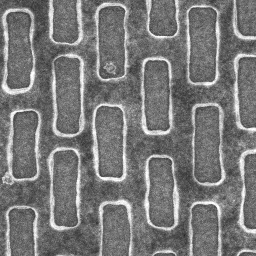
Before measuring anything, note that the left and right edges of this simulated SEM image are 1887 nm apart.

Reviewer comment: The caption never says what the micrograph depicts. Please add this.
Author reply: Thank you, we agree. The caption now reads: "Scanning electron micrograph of a regular array of holes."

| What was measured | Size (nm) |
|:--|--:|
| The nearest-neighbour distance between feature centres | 480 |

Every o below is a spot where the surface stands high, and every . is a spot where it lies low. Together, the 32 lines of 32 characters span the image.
oooooo....ooooooooo...ooooooo...
o...oo....oo....ooo...oo...oo...
o...oo....oo....ooo...oo...oo...
o...oo....oo....ooo...oo...ooo..
o...oo....oo....oooo..oo...ooo..
o...oooooooo....oooooooo...ooooo
o...oooooooo....oooooooo...ooooo
o...ooo...oo....ooo.oooo...ooo..
o...ooo...oo....oo...ooo...ooo..
o...ooo...ooo..ooo...ooo...ooo..
o...ooo...oooooooo...ooooooooo..
ooooooo...oooooooo...oooooooo...
ooooooo...oooooooo...ooooooooo..
ooooooo...oo...ooo...oooo..ooo..
oo...oo...oo...ooo...ooo....oo..
o....oo...oo...ooo...ooo....oo..
o....oo...oo...oooo.oooo....oooo
o....ooooooo...ooooooooo....oooo
o....ooooooo....oooooooo...ooooo
o....oo...oo....oooooooo...oooo.
o....o....oo....ooo...oo....oo..
o....o....oo....ooo...oo....oo..
ooooooo...ooooooooo...ooo...oo..
ooooooo...ooooooooo...oooooooo..
ooooooo...oooooooo....oooooooo..
ooooooo...ooo...oo....ooo.oooo..
o...ooo...ooo...oo....oo...ooo..
o...ooo...ooo...ooo...oo...ooo..
o...ooo.ooooo...oooooooo...oooo.
o...ooooooooo...oooooooo...ooooo
o...ooooooooo...oooooooo...ooooo
o...ooooooooo...oooooooo....oo.o